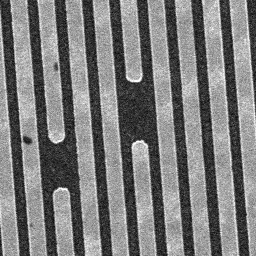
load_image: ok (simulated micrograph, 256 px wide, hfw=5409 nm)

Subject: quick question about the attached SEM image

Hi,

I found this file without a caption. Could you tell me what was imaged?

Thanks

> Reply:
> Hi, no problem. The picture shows parallel lines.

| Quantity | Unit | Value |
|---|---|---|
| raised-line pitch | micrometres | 0.577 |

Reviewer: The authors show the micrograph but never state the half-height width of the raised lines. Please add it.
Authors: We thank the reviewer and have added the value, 329 nm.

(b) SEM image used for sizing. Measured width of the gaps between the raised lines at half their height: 248 nm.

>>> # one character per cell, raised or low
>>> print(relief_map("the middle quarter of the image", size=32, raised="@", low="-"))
--@@@@---@@@---@@@@---@@@@---@@@
--@@@@---@@@----@@@---@@@@---@@@
--@@@@---@@@@---@@@---@@@@---@@@
--@@@@---@@@@---@@@----@@@---@@@
--@@@@---@@@@----------@@@---@@@
--@@@@---@@@@----------@@@----@@
--@@@@---@@@@----------@@@@---@@
--@@@@---@@@@----------@@@@---@@
--@@@@---@@@@----------@@@@---@@
---@@@---@@@@----------@@@@---@@
--@@@@---@@@@----------@@@@---@@
---@@@----@@@----------@@@@---@@
---@@@----@@@----------@@@@---@@
---@@@@---@@@----------@@@@---@@
---@@@@---@@@----------@@@@---@@
---@@@@---@@@@---------@@@@---@@
---@@@@---@@@@----------@@@---@@
---@@@@---@@@@----------@@@---@@
---@@@@---@@@@----------@@@----@
---@@@@---@@@@----@@----@@@@---@
---@@@@---@@@@---@@@@---@@@@---@
---@@@@---@@@@---@@@@---@@@@---@
----@@@---@@@@---@@@@---@@@@---@
----@@@---@@@@---@@@@---@@@@---@
----@@@----@@@---@@@@---@@@@---@
----@@@----@@@---@@@@---@@@@---@
----@@@@---@@@----@@@---@@@@---@
----@@@@---@@@----@@@---@@@@---@
----@@@@---@@@@---@@@----@@@---@
----@@@@---@@@@---@@@----@@@---@
----@@@@---@@@@---@@@@---@@@----
@---@@@@---@@@@---@@@@---@@@----